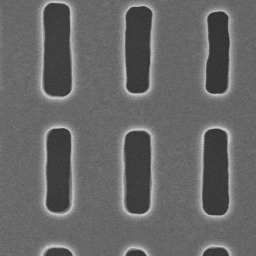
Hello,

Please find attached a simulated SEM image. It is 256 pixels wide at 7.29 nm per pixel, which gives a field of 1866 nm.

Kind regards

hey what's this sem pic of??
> holes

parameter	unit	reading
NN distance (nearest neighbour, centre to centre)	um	0.578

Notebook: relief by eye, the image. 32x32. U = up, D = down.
UUUUUUDDUUUUUUUUUUUUUUUUUUUUUUUU
UUUUUDDDDUUUUUUUDDDUUUUUUUUDUUUU
UUUUUDDDDUUUUUUUDDDUUUUUUUDDDUUU
UUUUUDDDDUUUUUUUDDDUUUUUUUDDDUUU
UUUUUUDDDUUUUUUUDDDUUUUUUUDDDUUU
UUUUUUDDDUUUUUUUDDDUUUUUUUDDDUUU
UUUUUDDDDUUUUUUUDDDUUUUUUUDDDUUU
UUUUUDDDDUUUUUUUDDDUUUUUUUDDDUUU
UUUUUDDDDUUUUUUUDDDUUUUUUUDDDUUU
UUUUUDDDDUUUUUUUDDDUUUUUUUDDDUUU
UUUUUDDDDUUUUUUUDDDUUUUUUUDDDUUU
UUUUUUDDDUUUUUUUDDUUUUUUUUDDUUUU
UUUUUUUUUUUUUUUUUUUUUUUUUUUUUUUU
UUUUUUUUUUUUUUUUUUUUUUUUUUUUUUUU
UUUUUUUUUUUUUUUUUUUUUUUUUUUUUUUU
UUUUUUUUUUUUUUUUUUUUUUUUUUUUUUUU
UUUUUUDDDUUUUUUUDDUUUUUUUUDDUUUU
UUUUUUDDDUUUUUUUDDDUUUUUUUDDUUUU
UUUUUUDDDUUUUUUDDDDUUUUUUDDDUUUU
UUUUUUDDDUUUUUUDDDDUUUUUUDDDDUUU
UUUUUUDDDUUUUUUUDDDUUUUUUDDDDUUU
UUUUUUDDDUUUUUUUDDDUUUUUUDDDDUUU
UUUUUUDDDUUUUUUUDDDUUUUUUDDDDUUU
UUUUUUDDDUUUUUUUDDDUUUUUUDDDDUUU
UUUUUUDDDUUUUUUUDDDUUUUUUDDDDUUU
UUUUUUDDDUUUUUUUDDDUUUUUUDDDDUUU
UUUUUUUDUUUUUUUUDDUUUUUUUUDDUUUU
UUUUUUUUUUUUUUUUUUUUUUUUUUUUUUUU
UUUUUUUUUUUUUUUUUUUUUUUUUUUUUUUU
UUUUUUUUUUUUUUUUUUUUUUUUUUUUUUUU
UUUUUUUUUUUUUUUUUUUUUUUUUUUUUUUU
UUUUUUDDDUUUUUUUDDUUUUUUUUDDUUUU